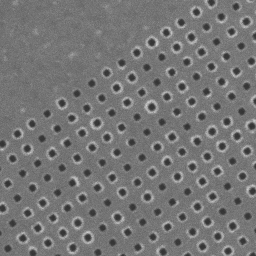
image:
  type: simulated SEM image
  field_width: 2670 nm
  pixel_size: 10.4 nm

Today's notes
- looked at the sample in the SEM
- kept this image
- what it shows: a regular array of holes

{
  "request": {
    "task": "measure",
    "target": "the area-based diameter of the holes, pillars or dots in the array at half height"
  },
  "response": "80.7 nm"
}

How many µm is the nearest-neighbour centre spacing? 0.184